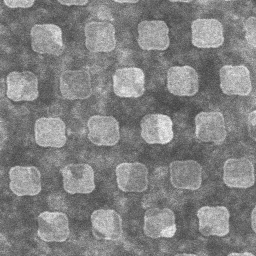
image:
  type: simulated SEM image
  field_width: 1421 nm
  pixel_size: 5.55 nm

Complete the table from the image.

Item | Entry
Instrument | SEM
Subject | a regular array of raised bodies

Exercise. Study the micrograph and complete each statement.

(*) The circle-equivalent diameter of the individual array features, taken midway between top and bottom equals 176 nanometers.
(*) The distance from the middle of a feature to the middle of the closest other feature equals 295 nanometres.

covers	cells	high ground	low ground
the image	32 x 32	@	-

-@@@----@@----------------------
--------------------------------
-------------------------@@----@
----@@@----@@@---@@@@---@@@@---@
----@@@@---@@@---@@@@---@@@@---@
----@@@@---@@@---@@@@---@@@@---@
-----@@-------------------------
--------------------------------
----------------------@@----@@@-
-@@@----@@@---@@@@---@@@@---@@@-
-@@@@---@@@---@@@@---@@@@---@@@-
-@@@@---@@@---@@@@---@@@----@@@-
--@@----------------------------
--------------------------------
------------------@@@----@@@---@
----@@@@---@@@@---@@@---@@@@---@
----@@@@---@@@@---@@@@---@@@---@
-----@@@---@@@@---@@@----@@@----
--------------------------------
--------------------------------
---------------@@----@@@@---@@@@
-@@@@---@@@@---@@@---@@@@---@@@@
-@@@@---@@@@---@@@---@@@@---@@@@
-@@@@---@@@@---@@@-----@@-------
--------------------------------
--------------------------------
------------@@----@@@----@@@----
-----@@@---@@@@---@@@@---@@@@---
-----@@@@---@@@---@@@@---@@@@---
-----@@@----@@@----@@-----------
--------------------------------
--------------------------------